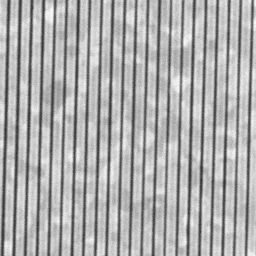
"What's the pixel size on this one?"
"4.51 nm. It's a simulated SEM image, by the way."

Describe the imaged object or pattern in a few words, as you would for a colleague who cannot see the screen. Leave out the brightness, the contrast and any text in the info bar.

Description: parallel lines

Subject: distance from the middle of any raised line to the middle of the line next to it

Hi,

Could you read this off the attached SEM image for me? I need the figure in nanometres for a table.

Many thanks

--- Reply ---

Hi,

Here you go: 52.3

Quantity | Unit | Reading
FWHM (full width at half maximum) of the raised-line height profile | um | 0.0366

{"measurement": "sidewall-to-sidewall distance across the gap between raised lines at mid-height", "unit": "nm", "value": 16.3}